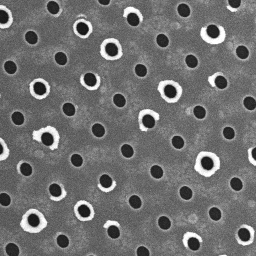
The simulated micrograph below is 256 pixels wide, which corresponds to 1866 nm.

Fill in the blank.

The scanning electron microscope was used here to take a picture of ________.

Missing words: a regular array of holes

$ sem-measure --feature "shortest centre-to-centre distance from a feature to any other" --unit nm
262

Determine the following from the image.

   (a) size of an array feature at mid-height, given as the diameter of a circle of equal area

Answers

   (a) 94.9 nanometers